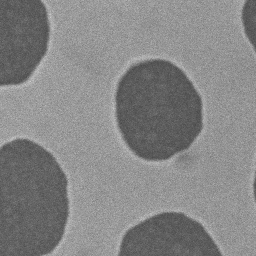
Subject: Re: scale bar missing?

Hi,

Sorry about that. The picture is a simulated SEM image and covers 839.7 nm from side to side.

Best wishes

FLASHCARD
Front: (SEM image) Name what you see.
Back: holes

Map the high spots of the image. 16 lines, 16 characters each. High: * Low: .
...************.
...************.
...*************
...*************
..******...*****
*******.....****
*******......***
*******......***
********....****
...*****...*****
....************
....************
....************
....******..****
....****.....***
...****.......**